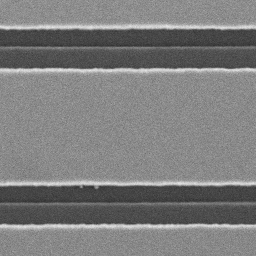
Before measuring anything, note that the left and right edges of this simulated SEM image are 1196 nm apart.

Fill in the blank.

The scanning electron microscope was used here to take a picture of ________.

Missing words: lines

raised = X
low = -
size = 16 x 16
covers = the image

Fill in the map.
XXXXXXXXXXXXXXXX
XXXXXXXXXXXXXXXX
----------------
----------------
XXXXXXXXXXXXXXXX
XXXXXXXXXXXXXXXX
XXXXXXXXXXXXXXXX
XXXXXXXXXXXXXXXX
XXXXXXXXXXXXXXXX
XXXXXXXXXXXXXXXX
XXXXXXXXXXXXXXXX
XXXXXXXXXXXXXXXX
----------------
----------------
XXXXXXXXXXXXXXXX
XXXXXXXXXXXXXXXX